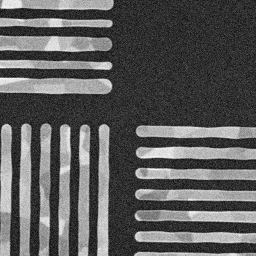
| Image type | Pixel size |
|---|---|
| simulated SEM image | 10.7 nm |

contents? groups of lines, slits or small figures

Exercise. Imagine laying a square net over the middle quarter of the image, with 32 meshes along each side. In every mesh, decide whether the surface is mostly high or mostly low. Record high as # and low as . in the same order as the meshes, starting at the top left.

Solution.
############....................
................................
................................
................................
############....................
############....................
############....................
................................
................................
................................
................................
................................
................................
................................
................................
#....#...##.....................
#...##...##.......##############
#...##...##.......##############
#...##...##.....................
#...##...##.....................
#...##...##.....................
#...##...##.......##############
##..##...##.......##############
#...##...##.....................
#...##...##.....................
#...##...##.....................
#...##...##.......###########.##
#...##...##.......##############
#...##...##..............###...#
#...##...##.....................
#...##...##.....................
#...##...##.....................